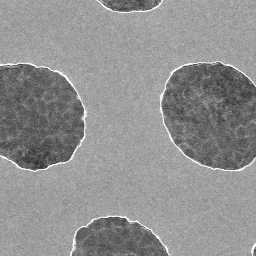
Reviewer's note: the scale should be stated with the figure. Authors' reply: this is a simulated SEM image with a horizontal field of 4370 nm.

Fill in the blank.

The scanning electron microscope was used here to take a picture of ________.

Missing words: holes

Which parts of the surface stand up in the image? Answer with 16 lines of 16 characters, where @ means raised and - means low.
@@@@@@@---@@@@@@
@@@@@@@@@@@@@@@@
@@@@@@@@@@@@@@@@
@@@@@@@@@@@@@@@@
----@@@@@@@----@
-----@@@@@------
-----@@@@@------
-----@@@@@------
-----@@@@@@-----
-----@@@@@@-----
@--@@@@@@@@@@-@@
@@@@@@@@@@@@@@@@
@@@@@@@@@@@@@@@@
@@@@@@@@@@@@@@@@
@@@@@----@@@@@@@
@@@@@-----@@@@@@